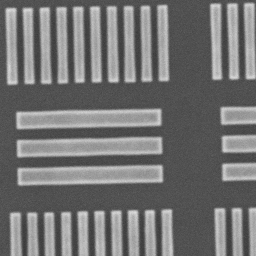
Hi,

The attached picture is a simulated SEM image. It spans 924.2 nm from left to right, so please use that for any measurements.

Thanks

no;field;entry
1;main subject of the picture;groups of lines, slits or small figures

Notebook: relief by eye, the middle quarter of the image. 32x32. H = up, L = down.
HLLHHLLHHLLHHLLHHLLLHHLLHHLLLLLL
HLLHHLLHHLLHHLLHHLLLHHLLHHLLLLLL
HLLHHLLHHLLHHHLHHHLLHHLLHHLLLLLL
HLLHHLLHHLLHHHLHHHLLHHLLHHLLLLLL
LLLLLLLLLLLLLLLLLLLLLLLLLLLLLLLL
LLLLLLLLLLLLLLLLLLLLLLLLLLLLLLLL
LLLLLLLLLLLLLLLLLLLLLLLLLLLLLLLL
LLLLLLLLLLLLLLLLLLLLLLLLLLLLLLLL
LLLLLLLLLLLLLLLLLLLLLLLLLLLLLLLL
LLLLLLLLLLLLLLLLLLLLLLLLLLLLLLLL
LLLLLLLLLLLLLLLLLLLLLLLLLLLLLLLL
LLLLLLLLLLLLLLLLLLLLHHHHLLLLLLLL
HHHHHHHHHHHHHHHHHHHHHHHHLLLLLLLL
HHHHHHHHHHHHHHHHHHHHHHHHLLLLLLLL
HHHHHHHHHHHHHHHHHHHHHHHHLLLLLLLL
HHHHHHHHHLLLLLLLLLLLLLLLLLLLLLLL
LLLLLLLLLLLLLLLLLLLLLLLLLLLLLLLL
LLLLLLLLLLLLLLLLLLLLLLLLLLLLLLLL
LLLLLLLLLLLLLLLLLHHHHHHHLLLLLLLL
HHHHHHHHHHHHHHHHHHHHHHHHLLLLLLLL
HHHHHHHHHHHHHHHHHHHHHHHHLLLLLLLL
HHHHHHHHHHHHHHHHHHHHHHHHLLLLLLLL
HHHHHHHHHHLLLLLLLLLLLLLLLLLLLLLL
LLLLLLLLLLLLLLLLLLLLLLLLLLLLLLLL
LLLLLLLLLLLLLLLLLLLLLLLLLLLLLLLL
LLLLLLLLLLLLLLLLLLLLLLLHLLLLLLLL
HHHHHHHHHHHHHHHHHHHHHHHHLLLLLLLL
HHHHHHHHHHHHHHHHHHHHHHHHLLLLLLLL
HHHHHHHHHHHHHHHHHHHHHHHHLLLLLLLL
HHHHHHHHHHHHHHHLLLLLLLLLLLLLLLLL
LLLLLLLLLLLLLLLLLLLLLLLLLLLLLLLL
LLLLLLLLLLLLLLLLLLLLLLLLLLLLLLLL